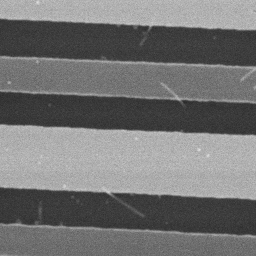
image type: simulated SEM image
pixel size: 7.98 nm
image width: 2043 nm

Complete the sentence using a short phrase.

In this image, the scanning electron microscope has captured lines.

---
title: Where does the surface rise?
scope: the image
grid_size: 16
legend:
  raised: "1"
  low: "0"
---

1111111111111111
0000000111111111
0000000000000000
0000000000000000
1111111111111111
1111111111111111
0000000000000000
0000000000000000
1111111111111111
1111111111111111
1111111111111111
1111111111111111
0000000000000000
0000000000000000
1111111111100000
1111111111111111